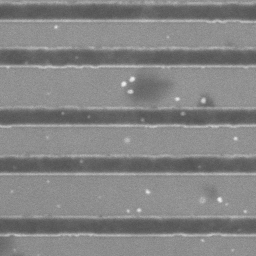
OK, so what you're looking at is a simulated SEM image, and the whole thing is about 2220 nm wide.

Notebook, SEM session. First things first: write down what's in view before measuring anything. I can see lines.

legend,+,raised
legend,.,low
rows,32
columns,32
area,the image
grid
++++++++++++++++++++++++++++++++
++++++++++++++++++++++++++++++++
++++++++++++++++++++++++++++++++
................................
................................
................................
++++++++++++++++++++++++++++++++
++++++++++++++++++++++++++++++++
................................
................................
................................
................................
................................
++++++++++++++++++..++++++++++++
++++++++++++++++++++++++++++++++
++++++++++++++++++++++++++++++++
................................
................................
................................
........+.+++....+.....+++++..+.
++++++++++++++++++++++++++++++++
++++++++++++++++++++++++++++++++
................................
................................
................................
................................
................................
++++++++++++++++++++++++++++++++
++++++++++++++++++++++++++++++++
................................
................................
................................